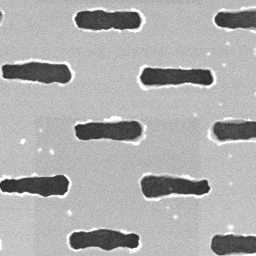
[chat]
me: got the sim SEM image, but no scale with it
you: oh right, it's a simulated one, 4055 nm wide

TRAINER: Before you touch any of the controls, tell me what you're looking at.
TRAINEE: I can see holes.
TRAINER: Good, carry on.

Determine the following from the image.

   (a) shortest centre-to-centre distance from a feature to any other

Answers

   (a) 1360 nanometers